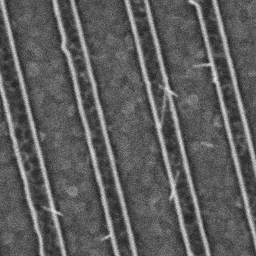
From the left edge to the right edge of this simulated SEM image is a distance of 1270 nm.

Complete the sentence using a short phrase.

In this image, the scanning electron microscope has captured one or a few lines or trenches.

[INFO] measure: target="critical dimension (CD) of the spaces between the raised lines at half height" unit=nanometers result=256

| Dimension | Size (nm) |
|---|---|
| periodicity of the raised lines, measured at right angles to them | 345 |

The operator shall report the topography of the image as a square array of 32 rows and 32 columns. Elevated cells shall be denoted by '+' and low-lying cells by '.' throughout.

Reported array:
.......++.......++......+++.....
+......++.......+++......++.....
+......+++......+++......++.....
+.......++.......++......+++....
+.......++.......++.......++....
++......++.......+++......++....
++......+++......+++......++....
++.......++.......++......+++...
++.......++.......++.......++...
+++......++.......+++......++...
+++......+++......+++......++...
+++.......++.......++......+++..
.++.......++.......++.......++..
.+++......++.......+++......++..
.+++......+++......+++......++..
.+++.......++.......++......+++.
.+++.......++.......++.......++.
..+++......++.......+++......++.
..+++......+++......+++......++.
..+++.......++.......++......+++
..+++.......++.......++.......++
...++.......++.......++.......++
...+++......+++......+++......++
...+++.......++.......++......++
....++.......++.......++.......+
....++.......++.......++.......+
....+++......+++......+++......+
....+++.......++.......++......+
.....++.......++.......++.......
.....++.......++.......++.......
.....+++......+++......+++......
.....+++.......++.......++......